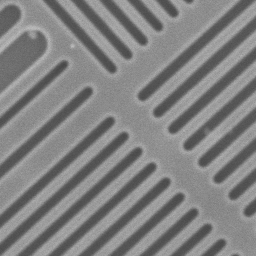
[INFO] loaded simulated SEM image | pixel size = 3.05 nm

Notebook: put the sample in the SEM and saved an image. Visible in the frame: groups of lines, slits or small figures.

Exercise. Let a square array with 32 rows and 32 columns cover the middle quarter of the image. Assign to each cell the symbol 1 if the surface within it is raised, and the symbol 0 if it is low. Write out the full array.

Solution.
01111111110001111111111111000011
11111111111001111111111110000111
11111111111111111111111100001111
11111111111111111111111000011110
11111111111111111111110001111100
11111111111111111111000011111000
11110001111111111110000011110000
11100001111111111110001111100001
11000011111111111110011110000111
10000111111111111111111100001111
00001111111111111111111000011111
00011111111111111111110000111110
00111111111111111111110001111000
01111111111011111111111011110000
11111111100001111111111111100001
11111111000011111111111111000011
11111110000111111111111111000111
11111100001111001111111111111111
11111000011110001111111111111110
11110000111000011111111111111100
11100011110000111111111111111100
11000111100001111000111111111100
10001111000011110000111111111111
00011110000111100001111111111111
00111100001111000011111111111111
01111000011110000111000111111111
11110000111100011110000111111111
11100001111000111100001111111111
11000111100001111000011110111111
10001111000011110000111100011111
00011110000111100001111000111111
00111100001111000011110001111111